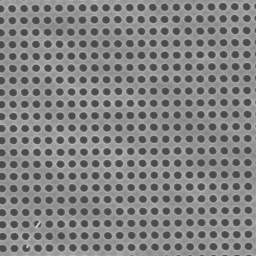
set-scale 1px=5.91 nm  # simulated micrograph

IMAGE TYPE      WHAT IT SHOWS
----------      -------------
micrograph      a regular array of holes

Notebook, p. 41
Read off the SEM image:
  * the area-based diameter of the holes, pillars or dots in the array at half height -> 43.2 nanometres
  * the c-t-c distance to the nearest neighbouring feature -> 11.6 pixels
